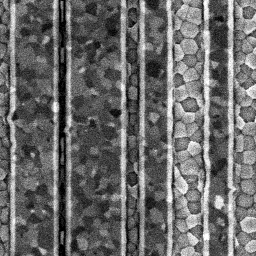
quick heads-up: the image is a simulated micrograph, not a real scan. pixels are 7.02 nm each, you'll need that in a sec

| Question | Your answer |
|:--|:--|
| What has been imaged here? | one or a few lines or trenches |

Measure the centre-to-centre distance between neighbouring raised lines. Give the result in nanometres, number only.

430